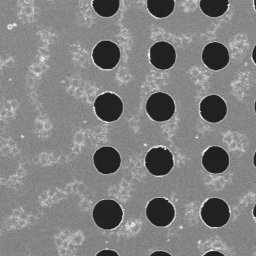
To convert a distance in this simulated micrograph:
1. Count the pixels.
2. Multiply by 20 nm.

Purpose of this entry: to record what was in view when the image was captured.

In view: a regular array of holes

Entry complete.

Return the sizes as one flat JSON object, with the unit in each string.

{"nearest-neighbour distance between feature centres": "1.03 um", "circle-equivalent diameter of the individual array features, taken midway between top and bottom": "568 nm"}